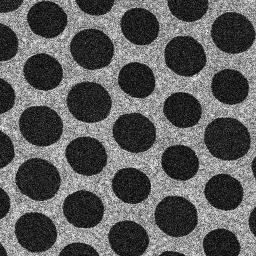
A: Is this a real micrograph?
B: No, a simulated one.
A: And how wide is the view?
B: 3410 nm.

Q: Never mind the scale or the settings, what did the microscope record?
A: a regular array of holes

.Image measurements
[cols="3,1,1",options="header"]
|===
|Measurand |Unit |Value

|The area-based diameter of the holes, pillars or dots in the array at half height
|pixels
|41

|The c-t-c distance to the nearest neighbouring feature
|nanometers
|706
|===